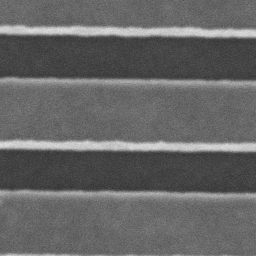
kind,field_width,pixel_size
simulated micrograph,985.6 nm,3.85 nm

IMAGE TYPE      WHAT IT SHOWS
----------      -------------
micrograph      lines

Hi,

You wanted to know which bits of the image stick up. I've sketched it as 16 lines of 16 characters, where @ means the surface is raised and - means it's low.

@@@@@@@@@@@@@@@@
@@@@@@@@@@@@@@@@
----------------
----------------
----------------
@@@@@@@@@@@@@@@@
@@@@@@@@@@@@@@@@
@@@@@@@@@@@@@@@@
@@@@@@@@@@@@@@@@
----------------
----------------
----------------
@@@@@@@@@@@@@@@@
@@@@@@@@@@@@@@@@
@@@@@@@@@@@@@@@@
@@@@@@@@@@@@@@@@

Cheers